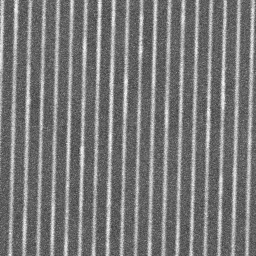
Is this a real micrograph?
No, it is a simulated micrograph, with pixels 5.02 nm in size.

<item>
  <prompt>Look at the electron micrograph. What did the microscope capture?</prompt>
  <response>parallel lines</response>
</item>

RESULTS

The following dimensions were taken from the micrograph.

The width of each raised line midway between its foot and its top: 13.8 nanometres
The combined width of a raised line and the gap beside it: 0.0698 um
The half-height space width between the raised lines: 0.0564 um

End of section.